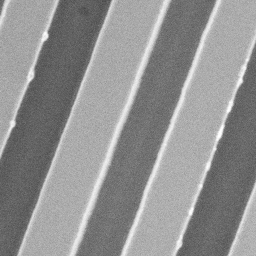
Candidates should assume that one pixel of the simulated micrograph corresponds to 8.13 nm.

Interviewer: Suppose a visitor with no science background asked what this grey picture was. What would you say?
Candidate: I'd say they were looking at lines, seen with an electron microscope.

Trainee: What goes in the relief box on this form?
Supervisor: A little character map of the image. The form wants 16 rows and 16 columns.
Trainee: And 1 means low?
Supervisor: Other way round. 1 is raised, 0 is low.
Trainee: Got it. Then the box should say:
1110000111000111
1110000111000111
1110001110000111
1100001110001111
1100011110001110
1100011100001110
1000011100011100
1000111100011100
0000111000111100
0000111000111000
0001110000111000
0001110001111000
0011110001110000
0011100001110001
0011100011100001
0111100011100011